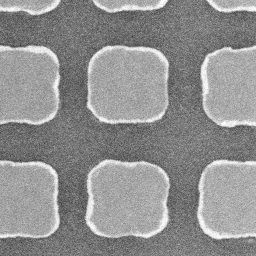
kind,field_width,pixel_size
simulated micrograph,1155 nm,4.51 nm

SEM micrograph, raised bodies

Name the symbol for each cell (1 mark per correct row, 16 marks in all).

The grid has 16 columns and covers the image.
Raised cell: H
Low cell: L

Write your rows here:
HHHLLLHHHHLLLHHH
LLLLLLLLLLLLLLLL
LLLLLLLLLLLLLLLL
HHHLLLHHHHLLLHHH
HHHHLLHHHHLLLHHH
HHHHLLHHHHLLLHHH
HHHHLLHHHHLLLHHH
HHHLLLHHHHLLLHHH
LLLLLLLLLLLLLLLL
LLLLLLLLLLLLLLLL
HHHLLLHHHHLLLHHH
HHHHLHHHHHHLLHHH
HHHHLLHHHHLLLHHH
HHHHLHHHHHLLHHHH
HHHLLLHHHHLLLHHH
LLLLLLLLLLLLLLLL